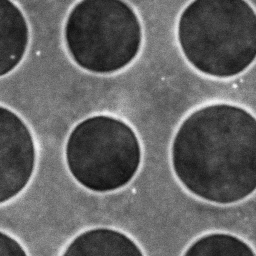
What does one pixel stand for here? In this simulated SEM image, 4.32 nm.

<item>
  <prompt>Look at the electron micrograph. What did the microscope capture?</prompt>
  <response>holes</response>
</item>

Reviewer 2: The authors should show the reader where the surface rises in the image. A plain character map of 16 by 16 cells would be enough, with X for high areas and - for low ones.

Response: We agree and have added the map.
-XXXX---XXXX----
--XX-----XX-----
--XX-----XX-----
-XXX----XXXX----
-XXXXX-XXXXXX--X
XXXXXXXXXXXXXXXX
XXXXXXXXXXXXX-XX
-XXXX--XXXXX----
--XX----XXX-----
--XX-----XX-----
--XX-----XX-----
--XXX---XXX-----
-XXXXXXXXXXXX--X
XXXXXXXXXXXXXXXX
XXXXX--XXXXXXXXX
-XXX-----XXX----